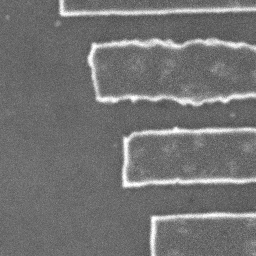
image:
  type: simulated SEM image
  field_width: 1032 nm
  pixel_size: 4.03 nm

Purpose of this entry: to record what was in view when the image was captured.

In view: one or a few lines or trenches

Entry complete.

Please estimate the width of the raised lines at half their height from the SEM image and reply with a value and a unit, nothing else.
0.217 microns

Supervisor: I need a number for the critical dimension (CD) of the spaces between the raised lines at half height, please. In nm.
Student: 130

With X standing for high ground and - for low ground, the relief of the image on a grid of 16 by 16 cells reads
----XXXXXXXXXXXX
----------------
----------------
------XXXXXXXXXX
------XXXXXXXXXX
------XXXXXXXXXX
----------------
----------------
--------XXXXXXXX
--------XXXXXXXX
--------XXXXXXXX
--------X-------
----------------
------------XXXX
----------XXXXXX
----------XXXXXX